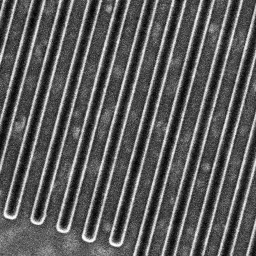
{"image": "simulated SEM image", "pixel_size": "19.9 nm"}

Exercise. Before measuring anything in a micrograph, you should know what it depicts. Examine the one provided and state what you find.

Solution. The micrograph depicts parallel lines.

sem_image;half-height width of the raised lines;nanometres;247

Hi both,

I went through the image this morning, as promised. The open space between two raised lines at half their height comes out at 298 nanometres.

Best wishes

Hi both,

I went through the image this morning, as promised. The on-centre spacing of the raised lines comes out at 541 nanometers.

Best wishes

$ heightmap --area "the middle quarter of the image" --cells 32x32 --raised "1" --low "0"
00111000011100001110000111000011
00111000011100001110000111000011
01110000111100011100001111000111
01110000111000011100001110000111
01110000111000011100001110000111
01110000111000011100001110000111
11100001110000111000011100001111
11100001110000111000011100001110
11100001110000111000011100001110
11100001100000111000011100001110
11000011100001110000111000011110
11000011100001110000111000011100
11000011100001110000111000011100
11000111100011110001111000011100
10000111000011100001110000111000
10000111000011100001110000111000
10000111000011100001110000111000
00001110000111000011110000111000
00001110000111000011100001110000
00001110000111000011100001110000
00001110000111000011100001110000
00011100001110000111100011110000
00011100001110000111000011100001
00011100001110000111000011100001
00011100001110000111000011100001
00111000011100001110000111100011
00111000011100001110000111000011
00111000011100001110000111000011
00111000011100001110000111000011
01110000111000011100001110000111
01110000111000011100001110000111
01110000111000011100001110000111